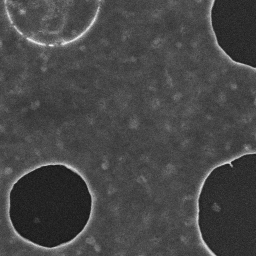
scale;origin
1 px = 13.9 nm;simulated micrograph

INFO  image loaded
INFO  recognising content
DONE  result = holes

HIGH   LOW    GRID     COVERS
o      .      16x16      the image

ooooooooooooo...
ooooooooooooo...
oooooooooooooo..
oooooooooooooo..
oooooooooooooooo
oooooooooooooooo
oooooooooooooooo
oooooooooooooooo
oooooooooooooooo
oooooooooooooooo
oo..oooooooooo..
o....oooooooo...
o.....oooooo....
o.....oooooo....
o....oooooooo...
ooooooooooooo...